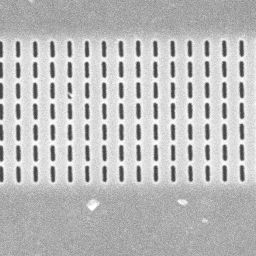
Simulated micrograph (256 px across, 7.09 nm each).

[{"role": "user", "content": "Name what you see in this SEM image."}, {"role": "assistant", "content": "a regular array of holes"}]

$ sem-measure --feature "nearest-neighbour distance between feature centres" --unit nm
120